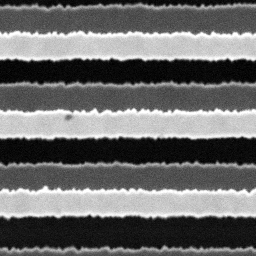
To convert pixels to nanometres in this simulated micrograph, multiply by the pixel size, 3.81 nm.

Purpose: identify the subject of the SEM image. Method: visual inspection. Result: lines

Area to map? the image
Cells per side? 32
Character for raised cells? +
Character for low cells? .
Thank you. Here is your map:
.............................+..
++++++++++++++++++++++++++++++++
++++++++++++++++++++++++++++++++
++++++++++++++++++++++++++++++++
++++++++++++++++++++++++++++++++
++++++++++++++++++++++++++++++++
++++++++++++++++++++++++++++++++
...++.++.......+..+..+....++...+
................................
................................
..++...+.+.++....+..++......++..
++++++++++++++++++++++++++++++++
++++++++++++++++++++++++++++++++
++++++++++++++++++++++++++++++++
++++++++++++++++++++++++++++++++
++++++++++++++++++++++++++++++++
++++++++++++++++++++++++++++++++
................................
................................
................................
.+.+.++.....+.++..++.+.++..+....
++++++++++++++++++++++++++++++++
++++++++++++++++++++++++++++++++
++++++++++++++++++++++++++++++++
++++++++++++++++++++++++++++++++
++++++++++++++++++++++++++++++++
++++++++++++++++++++++++++++++++
................................
................................
................................
................................
++++++++++++++++++++++++++++++++